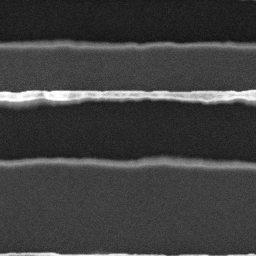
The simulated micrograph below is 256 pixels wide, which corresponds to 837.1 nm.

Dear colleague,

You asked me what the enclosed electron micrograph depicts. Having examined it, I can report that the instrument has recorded lines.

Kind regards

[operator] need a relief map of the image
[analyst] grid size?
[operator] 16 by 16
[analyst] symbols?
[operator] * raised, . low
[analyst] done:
................
................
................
****************
****************
****************
................
................
................
................
****************
****************
****************
****************
****************
****************